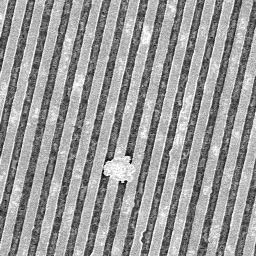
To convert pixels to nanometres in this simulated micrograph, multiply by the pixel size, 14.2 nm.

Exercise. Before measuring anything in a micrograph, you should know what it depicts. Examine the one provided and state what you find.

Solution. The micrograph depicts parallel lines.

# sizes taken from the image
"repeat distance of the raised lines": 260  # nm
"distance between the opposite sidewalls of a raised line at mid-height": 136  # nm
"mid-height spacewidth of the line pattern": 0.124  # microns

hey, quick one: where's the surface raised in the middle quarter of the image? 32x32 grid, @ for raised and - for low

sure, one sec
@--@@@--@@@--@@---@@--@@@--@@---
@--@@@--@@---@@--@@@--@@@--@@---
@--@@---@@--@@@--@@@--@@---@@--@
---@@---@@--@@---@@---@@--@@@--@
---@@--@@@--@@---@@---@@--@@---@
--@@@--@@---@@---@@--@@@--@@---@
--@@@--@@---@@--@@@--@@---@@--@@
--@@---@@--@@@--@@@--@@---@@--@@
--@@--@@@--@@---@@---@@--@@@--@@
-@@@--@@@--@@---@@--@@@--@@---@@
-@@@--@@---@@--@@@--@@@--@@---@@
-@@---@@--@@@--@@@--@@---@@--@@@
-@@---@@--@@@--@@---@@--@@@--@@-
-@@--@@@--@@---@@---@@--@@@--@@-
@@@--@@---@@---@@--@@@--@@---@@-
@@@--@@---@@--@@@--@@---@@--@@@-
@@---@@--@@@--@@@--@@--@@@--@@--
@@--@@@--@@@--@@---@@--@@@--@@--
@@--@@@--@@---@@--@@@--@@@--@@--
@@--@@---@@--@@@--@@@--@@--@@@--
@---@@--@@@--@@@--@@---@@--@@@--
@---@@--@@@--@@---@@--@@@--@@@--
@--@@@--@@---@@---@@--@@@-@@@---
@--@@---@@--@@@@@@@@--@@---@@--@
@--@@---@@-@@@@@-@@---@@--@@@--@
---@@--@@@@@@@@@@@@---@@--@@@--@
--@@@--@@@@@@@@@@@@--@@@--@@---@
--@@@--@@-@@@@@@@@@--@@@--@@---@
--@@--@@@--@@@@@@@---@@---@@--@@
--@@--@@@--@@@--@@--@@@--@@@--@@
--@@--@@---@@---@@--@@@--@@@--@@
-@@@--@@---@@---@@--@@@--@@---@@